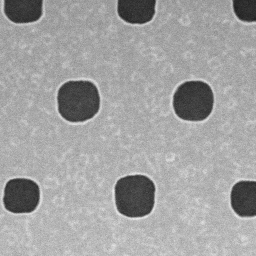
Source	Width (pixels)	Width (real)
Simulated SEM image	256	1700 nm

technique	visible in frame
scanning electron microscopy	holes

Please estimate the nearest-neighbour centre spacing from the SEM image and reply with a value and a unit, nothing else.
735 nm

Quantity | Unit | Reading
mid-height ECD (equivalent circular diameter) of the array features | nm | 287